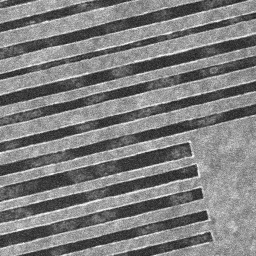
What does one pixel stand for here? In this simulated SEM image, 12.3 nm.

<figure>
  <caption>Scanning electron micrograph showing parallel lines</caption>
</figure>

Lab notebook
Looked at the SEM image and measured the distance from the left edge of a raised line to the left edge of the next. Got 22.8 px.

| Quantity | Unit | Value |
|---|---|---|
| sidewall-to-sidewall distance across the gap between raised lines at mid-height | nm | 133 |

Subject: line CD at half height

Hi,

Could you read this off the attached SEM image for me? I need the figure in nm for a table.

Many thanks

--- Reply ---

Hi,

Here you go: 142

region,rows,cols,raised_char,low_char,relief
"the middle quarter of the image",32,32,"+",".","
+++++++++++++...............++++
+++++++++...............++++++++
+++++..............+++++++++....
+.............++++++++++........
...........+++++++++............
.......+++++++++...........+++++
...++++++++............+++++++++
+++++++............+++++++++++++
++++...........+++++++++++++++..
..........++++++++++++++++......
.......++++++++++++++...........
..++++++++++++++++...........+++
+++++++++++++............+++++++
++++++++++..........++++++++++++
+++++...........+++++++++++++...
+...........+++++++++++++.......
........++++++++++++............
....+++++++++++++............+++
++++++++++++.............+++++++
++++++++............++++++++++++
+++++...........++++++++++......
............++++++++++..........
........++++++++++..............
....++++++++++................++
.+++++++++................++++++
++++++................+++++++++.
+.................+++++++++.....
..............+++++++++.........
..........+++++++++.............
.....+++++++++..............++++
.++++++++++.............++++++++
+++++++.............+++++++++++.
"